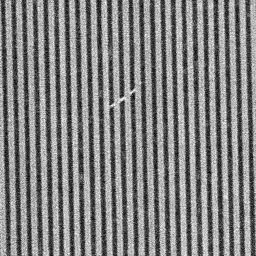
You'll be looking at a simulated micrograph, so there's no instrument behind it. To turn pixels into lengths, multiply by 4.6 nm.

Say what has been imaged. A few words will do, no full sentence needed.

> parallel lines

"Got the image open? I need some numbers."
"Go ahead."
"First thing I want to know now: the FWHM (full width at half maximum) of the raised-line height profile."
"24.2 nanometres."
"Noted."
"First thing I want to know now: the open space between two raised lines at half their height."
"5.37 px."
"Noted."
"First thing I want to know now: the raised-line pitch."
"48.9 nm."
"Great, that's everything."